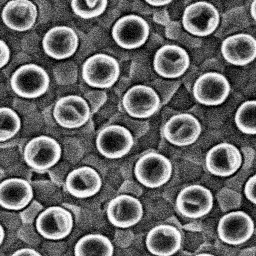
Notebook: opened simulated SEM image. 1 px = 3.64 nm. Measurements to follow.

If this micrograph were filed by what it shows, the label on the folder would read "a regular array of raised bodies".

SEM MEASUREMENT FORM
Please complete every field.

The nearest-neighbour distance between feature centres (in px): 49.4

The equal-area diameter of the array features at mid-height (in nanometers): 120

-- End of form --